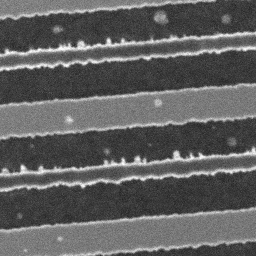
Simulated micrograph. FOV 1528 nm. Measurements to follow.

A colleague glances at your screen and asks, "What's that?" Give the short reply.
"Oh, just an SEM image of lines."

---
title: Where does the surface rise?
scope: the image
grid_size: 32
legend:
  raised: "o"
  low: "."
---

ooooooooooooooooooooo...........
ooooooooooo.....................
................................
................................
...........................ooooo
...............ooooooooooooooooo
....oooooooooooooooooooooooo....
oooooooooooooooo................
oo..............................
................................
................................
...................ooooooooooooo
.......ooooooooooooooooooooooooo
oooooooooooooooooooooooooooooooo
oooooooooooooooooooooooooooooooo
ooooooooooooooooooooooo.........
ooooooooo.......................
................................
................................
..........................oooooo
..............oooooooooooooooooo
..ooooooooooooooooooooooooo.o...
oooooooooooooooo................
ooo.oo..........................
................................
................................
..........................oooooo
...............ooooooooooooooooo
...ooooooooooooooooooooooooooooo
oooooooooooooooooooooooooooooooo
ooooooooooooooooooooooooooo.....
ooooooooooooooooo...............